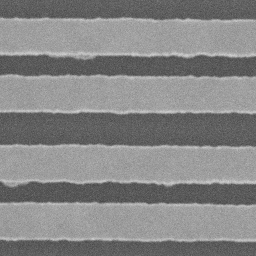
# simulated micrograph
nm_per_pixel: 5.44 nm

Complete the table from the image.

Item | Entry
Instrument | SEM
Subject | lines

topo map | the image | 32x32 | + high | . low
................................
................................
+++++++++++++++++++...++........
++++++++++++++++++++++++++++++++
++++++++++++++++++++++++++++++++
++++++++++++++++++++++++++++++++
++++++++++++++++++++++++++++++++
................................
................................
.++.........+...................
++++++++++++++++++++++++++++++++
++++++++++++++++++++++++++++++++
++++++++++++++++++++++++++++++++
++++++++++++++++++++++++++++++++
................................
................................
................................
................................
++++++++++++++++++++++++++++++++
++++++++++++++++++++++++++++++++
++++++++++++++++++++++++++++++++
++++++++++++++++++++++++++++++++
++++++++++++++++++++++++++++++++
................................
................................
++++++++++++++++++..+...+.......
++++++++++++++++++++++++++++++++
++++++++++++++++++++++++++++++++
++++++++++++++++++++++++++++++++
++++++++++++++++++++++++++++++++
................................
................................